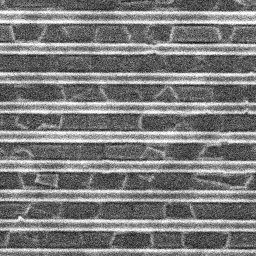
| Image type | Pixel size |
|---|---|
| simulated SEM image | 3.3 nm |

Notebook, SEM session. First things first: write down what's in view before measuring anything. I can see parallel lines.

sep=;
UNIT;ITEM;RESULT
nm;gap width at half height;65.5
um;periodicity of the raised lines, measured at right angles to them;0.098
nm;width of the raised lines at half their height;32.6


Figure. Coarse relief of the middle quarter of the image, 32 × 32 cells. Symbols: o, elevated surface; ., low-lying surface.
................................
................................
ooooooooooooooooooooooo.........
oooooooooooooooooooooooooooooooo
oooooooooooooooooooooooooooooooo
................................
................................
................................
................................
................................
oooooooooooooooooooooooooooooooo
oooooooooooooooooooooooooooooooo
................................
................................
................................
................................
................................
oooooooooooooooooooooooooooooooo
oooooooooooooooooooooooooooooooo
................................
................................
................................
................................
................................
oooooooooooooooooo..oooooooooooo
oooooooooooooooooooooooooooooooo
oooooooooooooooooooooooooooooooo
................................
................................
................................
................................
................................